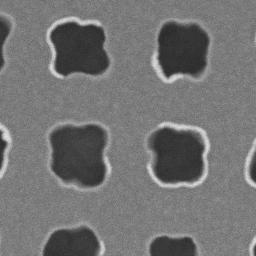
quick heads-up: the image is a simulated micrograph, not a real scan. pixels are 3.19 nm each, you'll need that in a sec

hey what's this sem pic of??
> holes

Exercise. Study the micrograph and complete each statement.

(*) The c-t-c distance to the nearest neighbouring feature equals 0.32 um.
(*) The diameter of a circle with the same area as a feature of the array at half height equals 179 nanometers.